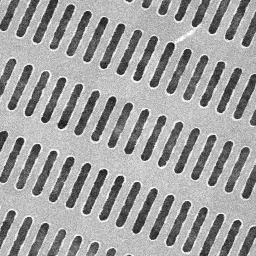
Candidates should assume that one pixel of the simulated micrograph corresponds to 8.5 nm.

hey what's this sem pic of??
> a regular array of holes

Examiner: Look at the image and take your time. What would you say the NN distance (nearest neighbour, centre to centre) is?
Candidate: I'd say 17.9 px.